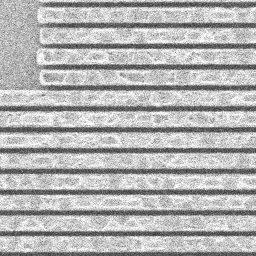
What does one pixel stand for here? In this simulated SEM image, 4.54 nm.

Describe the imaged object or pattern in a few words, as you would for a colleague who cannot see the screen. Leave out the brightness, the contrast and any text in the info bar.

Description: parallel lines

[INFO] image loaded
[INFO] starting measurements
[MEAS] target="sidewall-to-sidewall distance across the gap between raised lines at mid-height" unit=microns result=0.025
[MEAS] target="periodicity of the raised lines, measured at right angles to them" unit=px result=20.8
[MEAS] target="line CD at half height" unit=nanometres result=71.5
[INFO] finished